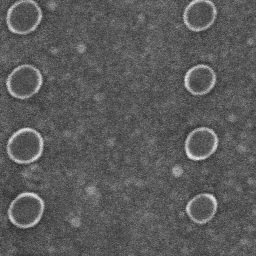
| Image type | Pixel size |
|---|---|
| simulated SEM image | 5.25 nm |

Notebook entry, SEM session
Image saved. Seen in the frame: raised bodies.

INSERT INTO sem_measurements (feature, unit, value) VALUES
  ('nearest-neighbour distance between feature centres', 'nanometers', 337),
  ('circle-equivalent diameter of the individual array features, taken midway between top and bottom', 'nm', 168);